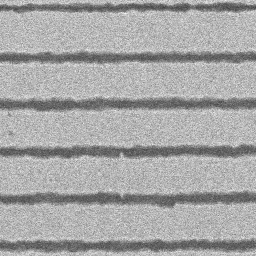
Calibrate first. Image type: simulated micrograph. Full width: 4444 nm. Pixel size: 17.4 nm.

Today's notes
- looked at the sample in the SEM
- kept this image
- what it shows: parallel lines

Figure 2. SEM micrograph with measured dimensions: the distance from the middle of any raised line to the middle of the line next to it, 47.6 px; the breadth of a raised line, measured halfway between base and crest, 619 nanometers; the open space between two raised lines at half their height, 11.3 pixels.